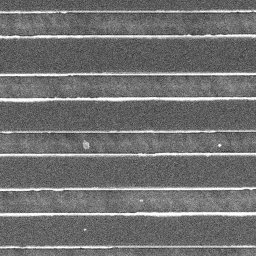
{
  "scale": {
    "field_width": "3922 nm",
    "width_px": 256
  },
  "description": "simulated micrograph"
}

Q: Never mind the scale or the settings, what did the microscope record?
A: lines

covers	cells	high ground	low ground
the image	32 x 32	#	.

################################
########........................
................................
................................
.......................#...##.##
################################
################################
################################
################################
................................
................................
................................
################################
################################
################################
################################
##..............................
................................
................................
################################
################################
################################
################################
################################
................................
................................
................................
################################
################################
################################
################################
................................